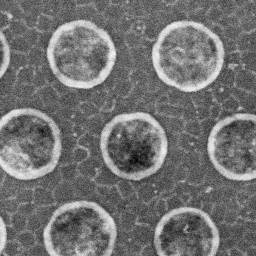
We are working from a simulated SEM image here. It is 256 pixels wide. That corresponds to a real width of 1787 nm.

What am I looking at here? raised bodies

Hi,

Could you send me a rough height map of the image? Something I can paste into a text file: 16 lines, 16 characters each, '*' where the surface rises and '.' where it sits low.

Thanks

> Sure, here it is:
................
...........*....
...****...***...
...****...****..
....***...****..
...........*....
................
***....**.....**
****...***...***
****...***...***
***....***....**
................
................
...****....**...
...****...***...
...****...***...